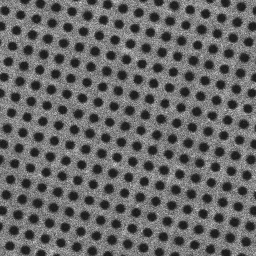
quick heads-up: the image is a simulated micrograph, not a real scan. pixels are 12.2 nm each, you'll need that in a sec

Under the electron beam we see a regular array of holes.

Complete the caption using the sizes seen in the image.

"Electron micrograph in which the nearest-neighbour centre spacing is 196 nm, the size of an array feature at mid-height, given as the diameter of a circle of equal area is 117 nm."